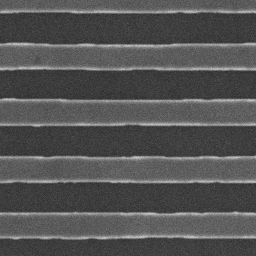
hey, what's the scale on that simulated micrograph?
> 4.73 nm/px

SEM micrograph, lines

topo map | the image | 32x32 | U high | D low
UUUUUUUUUUUUUUUUUUUUUUUUUUUUUUUU
UUUDDDDDDUUUUUUUUUUUUUDUUDDUUUUU
DDDDDDDDDDDDDDDDDDDDDDDDDDDDDDDD
DDDDDDDDDDDDDDDDDDDDDDDDDDDDDDDD
DDDDDDDDDDDDDDDDDDDDDDDDDDDDDDDD
UUUUDDDDDDDDDDDDDDDDDDDDDDDDDDUU
UUUUUUUUUUUUUUUUUUUUUUUUUUUUUUUU
UUUUUUUUUUUUUUUUUUUUUUUUUUUUUUUU
UUUUUUUUUUUUUUUUUUUUUUUUUUUUUUUU
DDDDDDDDDDDDDDDDDDDDDDDDDDDDDDDD
DDDDDDDDDDDDDDDDDDDDDDDDDDDDDDDD
DDDDDDDDDDDDDDDDDDDDDDDDDDDDDDDD
UUUUUUUUUDDDDDDDDDDDDDUUUUUUUUUU
UUUUUUUUUUUUUUUUUUUUUUUUUUUUUUUU
UUUUUUUUUUUUUUUUUUUUUUUUUUUUUUUU
UUUUUUUUUUUUUUUUUUUUUUUUUUUUUUUU
DDDDDDDDDDDDDDDDDDDDDDDDDDDDDDDD
DDDDDDDDDDDDDDDDDDDDDDDDDDDDDDDD
DDDDDDDDDDDDDDDDDDDDDDDDDDDDDDDD
DDDDDDDDDDDDDDDDDDDDDDDDDDDDDDDD
UUUUUUUUUUUUUUUUUUUUUUUUUUUUUUUU
UUUUUUUUUUUUUUUUUUUUUUUUUUUUUUUU
UUUUUUUUUUUUUUUUUUUUUUUUUUUUUUUU
DDDDDDDDDDDDDDDDDDDDDDDDDDDDDDDD
DDDDDDDDDDDDDDDDDDDDDDDDDDDDDDDD
DDDDDDDDDDDDDDDDDDDDDDDDDDDDDDDD
DDDDDDDDDDDDDDDDDDDDDDDDDDDDDDDD
UUUUUUUUUUUUUUUUUUUUUUUUUUUUUUUU
UUUUUUUUUUUUUUUUUUUUUUUUUUUUUUUU
UUUUUUUUUUUUUUUUUUUUUUUUUUUUUUUU
DDDDDDDDDDDDDDDDDDDDDDDDDDDDDDDD
DDDDDDDDDDDDDDDDDDDDDDDDDDDDDDDD